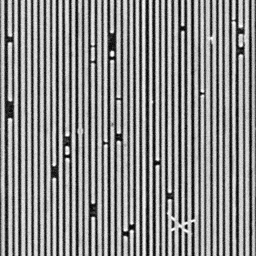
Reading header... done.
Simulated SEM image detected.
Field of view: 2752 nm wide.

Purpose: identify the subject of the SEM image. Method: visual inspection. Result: parallel lines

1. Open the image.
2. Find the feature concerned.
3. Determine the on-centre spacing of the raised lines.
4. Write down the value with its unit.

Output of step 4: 6.44 px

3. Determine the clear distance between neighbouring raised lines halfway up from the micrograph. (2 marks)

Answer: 36.3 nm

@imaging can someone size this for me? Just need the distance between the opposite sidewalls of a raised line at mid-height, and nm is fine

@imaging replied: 36.3